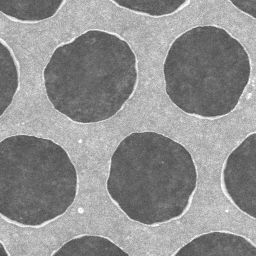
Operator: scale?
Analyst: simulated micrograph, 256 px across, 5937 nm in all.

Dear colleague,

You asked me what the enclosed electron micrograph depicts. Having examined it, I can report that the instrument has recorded holes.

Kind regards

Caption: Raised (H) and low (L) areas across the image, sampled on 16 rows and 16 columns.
LLLLHHHHLLLHHHHL
HHHHHHHHHHHHHHHH
HHHHHLLLHHHLLLLH
LHHLLLLLHHLLLLLH
LHHLLLLLLHLLLLLL
LHHLLLLLHHLLLLLH
LHHLLLLLHHHLLLLH
HHHHHLLHHHHHHHHH
HLHHHHHHLLHHHHHH
LLLLHHHLLLLLHHHL
LLLLLHHLLLLLHHLL
LLLLLHHLLLLLHHLL
LLLLLHHLLLLLHHLL
LLLLHHHHLLLHHHHH
HHHHHHHHHHHHHHHH
HHHHLLLHHHHLLLLL